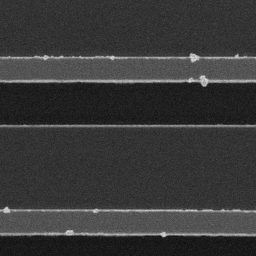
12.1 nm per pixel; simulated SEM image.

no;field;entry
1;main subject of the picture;lines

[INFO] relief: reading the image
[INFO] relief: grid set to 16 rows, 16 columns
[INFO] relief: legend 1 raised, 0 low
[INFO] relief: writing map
1111111111111111
1111111111111111
1111111111111111
1111111111111111
1111111111111111
0000000000000000
0000000000000000
0000000000000000
1111111111111111
1111111111111111
1111111111111111
1111111111111111
1111111111111111
1111111111111111
1111111111111111
0000000000000000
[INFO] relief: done